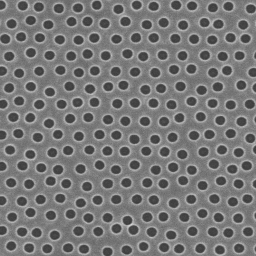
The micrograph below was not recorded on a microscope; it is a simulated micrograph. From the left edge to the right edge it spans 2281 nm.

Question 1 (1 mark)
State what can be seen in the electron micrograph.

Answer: a regular array of holes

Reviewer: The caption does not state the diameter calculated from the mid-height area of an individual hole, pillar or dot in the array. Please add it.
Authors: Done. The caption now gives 89.3 nm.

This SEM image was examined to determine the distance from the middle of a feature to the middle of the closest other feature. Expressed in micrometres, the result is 0.144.